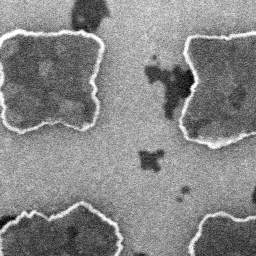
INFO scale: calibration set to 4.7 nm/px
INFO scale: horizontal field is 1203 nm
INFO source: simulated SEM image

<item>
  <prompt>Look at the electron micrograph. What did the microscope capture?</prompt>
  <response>raised bodies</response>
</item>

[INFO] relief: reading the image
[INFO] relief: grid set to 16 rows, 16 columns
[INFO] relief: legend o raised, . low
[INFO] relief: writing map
................
................
oooooo......oooo
oooooo......oooo
oooooo......oooo
oooooo......oooo
oooooo......oooo
oooooo.....ooooo
............ooo.
................
................
................
................
.ooooo.......o..
ooooooo.....oooo
ooooooo.....oooo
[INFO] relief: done